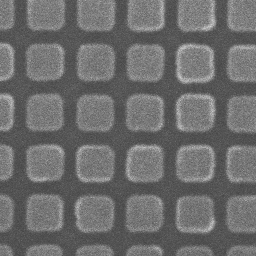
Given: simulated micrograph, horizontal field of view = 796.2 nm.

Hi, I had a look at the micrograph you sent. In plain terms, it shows a regular array of raised bodies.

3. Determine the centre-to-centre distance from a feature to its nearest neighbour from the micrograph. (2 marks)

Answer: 154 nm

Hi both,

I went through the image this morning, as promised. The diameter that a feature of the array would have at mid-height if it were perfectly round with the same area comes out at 124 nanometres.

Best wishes